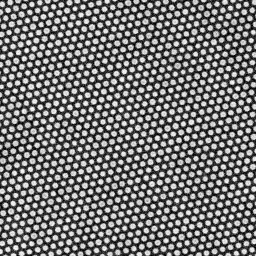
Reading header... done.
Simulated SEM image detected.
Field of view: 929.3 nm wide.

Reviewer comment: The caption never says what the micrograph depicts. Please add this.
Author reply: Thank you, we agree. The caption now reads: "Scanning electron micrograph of a regular array of raised bodies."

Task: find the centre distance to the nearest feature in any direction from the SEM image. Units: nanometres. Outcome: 28.9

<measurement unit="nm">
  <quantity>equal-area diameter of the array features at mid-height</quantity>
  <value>18.8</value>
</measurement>